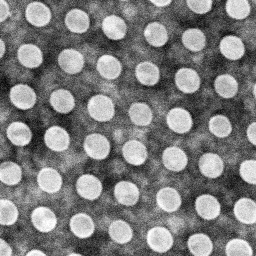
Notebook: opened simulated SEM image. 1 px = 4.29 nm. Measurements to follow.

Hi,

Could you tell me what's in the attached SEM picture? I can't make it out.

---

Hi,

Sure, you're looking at a regular array of raised bodies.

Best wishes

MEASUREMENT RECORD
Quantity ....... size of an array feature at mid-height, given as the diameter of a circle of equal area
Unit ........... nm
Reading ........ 100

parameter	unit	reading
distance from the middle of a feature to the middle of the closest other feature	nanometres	166